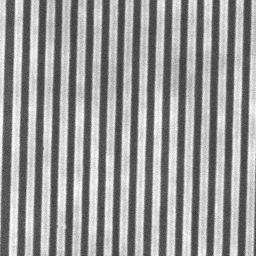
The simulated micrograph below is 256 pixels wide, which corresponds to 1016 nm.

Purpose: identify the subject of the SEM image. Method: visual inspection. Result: parallel lines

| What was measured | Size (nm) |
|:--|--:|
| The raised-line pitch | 62.5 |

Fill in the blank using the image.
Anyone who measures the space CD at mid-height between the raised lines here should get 9.12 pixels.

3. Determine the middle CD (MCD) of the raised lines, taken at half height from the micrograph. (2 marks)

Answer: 0.0293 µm